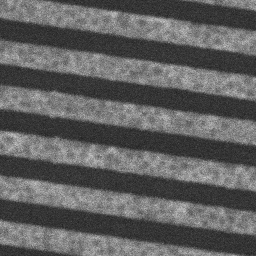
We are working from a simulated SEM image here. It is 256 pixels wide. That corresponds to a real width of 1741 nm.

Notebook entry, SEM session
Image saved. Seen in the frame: parallel lines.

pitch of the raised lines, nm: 303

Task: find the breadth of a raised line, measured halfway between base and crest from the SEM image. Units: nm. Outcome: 153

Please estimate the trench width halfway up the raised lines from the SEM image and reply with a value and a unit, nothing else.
153 nm